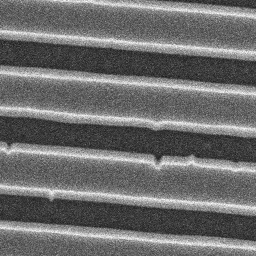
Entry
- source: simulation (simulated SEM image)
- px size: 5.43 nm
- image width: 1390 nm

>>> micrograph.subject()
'one or a few lines or trenches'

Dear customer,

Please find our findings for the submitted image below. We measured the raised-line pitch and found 418 nm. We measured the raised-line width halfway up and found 232 nanometres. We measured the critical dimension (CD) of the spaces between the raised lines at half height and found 186 nanometres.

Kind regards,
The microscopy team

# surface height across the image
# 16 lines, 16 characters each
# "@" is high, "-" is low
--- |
@@@@@@@@@@@@----
@@@@@@@@@@@@@@@@
----@@@@@@@@@@@@
----------------
@@--------------
@@@@@@@@@@@@@@--
@@@@@@@@@@@@@@@@
------@@@@@@@@@@
----------------
@@@@@-----------
@@@@@@@@@@@@@@@@
@@@@@@@@@@@@@@@@
--------@@@@@@@@
----------------
@@@@@@----------
@@@@@@@@@@@@@@@@